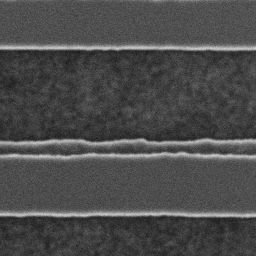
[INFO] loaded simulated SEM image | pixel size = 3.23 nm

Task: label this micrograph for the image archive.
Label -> lines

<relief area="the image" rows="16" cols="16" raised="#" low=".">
################
################
################
................
................
................
................
................
................
################
################
################
################
...###.....#####
................
................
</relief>